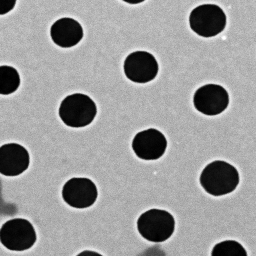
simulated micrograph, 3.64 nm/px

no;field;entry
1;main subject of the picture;a regular array of holes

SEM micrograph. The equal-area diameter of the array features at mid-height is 121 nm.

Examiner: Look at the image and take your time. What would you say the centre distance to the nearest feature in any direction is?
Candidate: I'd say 282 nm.